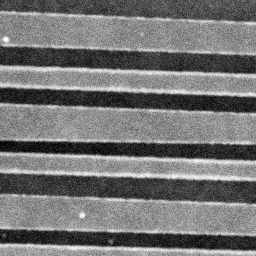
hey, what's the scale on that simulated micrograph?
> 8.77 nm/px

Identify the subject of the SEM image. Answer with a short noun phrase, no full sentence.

lines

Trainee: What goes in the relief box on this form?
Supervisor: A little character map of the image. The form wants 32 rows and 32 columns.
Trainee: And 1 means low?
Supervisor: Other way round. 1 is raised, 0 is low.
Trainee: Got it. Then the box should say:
00000000000000000000000000000000
00000000000000000000000000000000
11111111111111111111110000000000
11111111111111111111111111111111
11111111111111111111111111111111
11111111111111111111111111111111
00000000000000000000000111111111
00000000000000000000000000000000
11111110000000000000000000000000
11111111111111111111111111111111
11111111111111111111111111111111
00000000000000001111111111111111
00000000000000000000000000000000
11111111111000000000000000000000
11111111111111111111111111111111
11111111111111111111111111111111
11111111111111111111111111111111
00111111111111111111111111111111
00000000000000000000000000000000
11111111111110000000000000000000
11111111111111111111111111111111
11111111111111111111111111111111
00000000000000000000000000001111
00000000000000000000000000000000
11111100000000000000000000000000
11111111111111111111111111111110
11111111111111111111111111111111
11111111111111111111111111111111
11111111111111111111111111111111
00000000000000000000000000000000
00000000000000000000000000000000
11111111111111111111111111111111